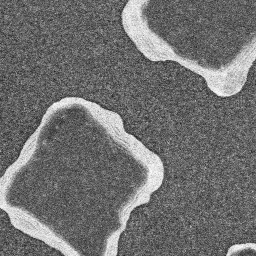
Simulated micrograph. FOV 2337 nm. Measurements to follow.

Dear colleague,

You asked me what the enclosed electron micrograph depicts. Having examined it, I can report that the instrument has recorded raised bodies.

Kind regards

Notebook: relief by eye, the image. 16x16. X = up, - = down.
--------XXXXXXXX
--------XXXXXXXX
---------XXXXXXX
----------XXXXXX
------------XXX-
----------------
---XXX----------
---XXXX---------
--XXXXXX--------
--XXXXXXX-------
-XXXXXXXXX------
XXXXXXXXXX------
XXXXXXXXX-------
-XXXXXXX--------
--XXXXX---------
----XXX--------X